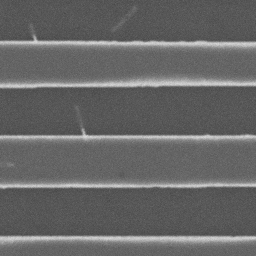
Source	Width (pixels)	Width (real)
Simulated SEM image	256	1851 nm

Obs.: lines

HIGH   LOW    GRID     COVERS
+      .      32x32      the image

................................
................................
................................
................................
................................
++++++++++++++++++++++++++++++++
++++++++++++++++++++++++++++++++
++++++++++++++++++++++++++++++++
++++++++++++++++++++++++++++++++
++++++++++++++++++++++++++++++++
++++++++++++++++++++++++++++++++
................................
................................
................................
................................
................................
................................
++++++++++++++++++++++++++++++++
++++++++++++++++++++++++++++++++
++++++++++++++++++++++++++++++++
++++++++++++++++++++++++++++++++
++++++++++++++++++++++++++++++++
++++++++++++++++++++++++++++++++
................................
................................
................................
................................
................................
................................
................................
++++++++++++++++++++++++++++++++
++++++++++++++++++++++++++++++++